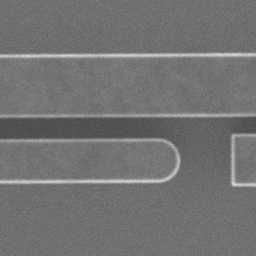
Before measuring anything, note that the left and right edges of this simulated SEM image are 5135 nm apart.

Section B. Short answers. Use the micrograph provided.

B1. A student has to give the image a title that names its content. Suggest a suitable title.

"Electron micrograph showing groups of lines, slits or small figures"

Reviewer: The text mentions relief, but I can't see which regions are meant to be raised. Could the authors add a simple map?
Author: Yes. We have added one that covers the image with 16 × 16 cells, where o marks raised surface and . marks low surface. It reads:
................
................
................
....oooooooooooo
oooooooooooooooo
oooooooooooooooo
oooooooooooooooo
................
...............o
ooooooooooo....o
ooooooooooo....o
...............o
................
................
................
................